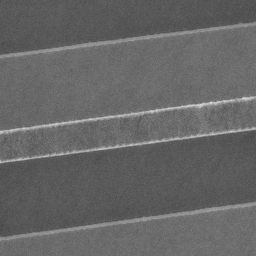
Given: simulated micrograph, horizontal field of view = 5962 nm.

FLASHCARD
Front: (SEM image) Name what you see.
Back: lines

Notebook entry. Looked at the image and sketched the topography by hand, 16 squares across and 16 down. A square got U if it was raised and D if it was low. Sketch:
DDDDDDDDDDDDDDDD
DDDDDDDDDDDDDDDD
DDDDDDDDUUUUUUUU
UUUUUUUUUUUUUUUU
UUUUUUUUUUUUUUUU
UUUUUUUUUUUUUUUU
UUUUUUUUUUUUUUUU
UUUUUUUUUUUUUUUU
UUUUUUUUUUUUUDDD
UUUUUDDDDDDDDDDD
DDDDDDDDDDDDDDDD
DDDDDDDDDDDDDDDD
DDDDDDDDDDDDDDDD
DDDDDDDDDDDUUUUU
DDDUUUUUUUUUUUUU
UUUUUUUUUUUUUUUU